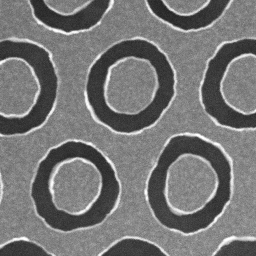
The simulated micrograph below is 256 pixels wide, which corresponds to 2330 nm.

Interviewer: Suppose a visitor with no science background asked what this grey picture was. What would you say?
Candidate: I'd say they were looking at ring-shaped grooves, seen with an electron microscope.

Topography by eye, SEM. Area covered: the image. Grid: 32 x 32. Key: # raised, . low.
####..#####...#####..#####...###
####...##....######...###...####
#####........#######.......#####
######.....###########...#######
################################
....###########....#########....
......#######.......#######.....
.##...######...###...#####...###
####...####...#####...####..####
####...####..#######..####..####
#####..####..#######..###...####
#####..####..######...###...####
#####..####..######..####...####
####...####...####...#####...###
..#...######........######......
.....########......########.....
...############..###############
#####################.....######
#######.....#########.......####
######.......#######...##...####
#####..#####..######.#####...###
#####..#####..#####..######..###
####..#######..####..######..###
####..#######..###...######..###
####...#####...###...######..###
####...#####..#####..#####..####
#####...###...#####...##....####
######.......#######.......#####
######....###########.....######
################################
#...##########.....#########....
......#######.......#######.....